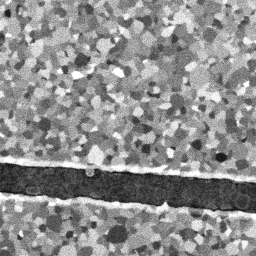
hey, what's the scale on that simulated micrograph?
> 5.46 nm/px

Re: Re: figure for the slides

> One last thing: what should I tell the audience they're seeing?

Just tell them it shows one or a few lines or trenches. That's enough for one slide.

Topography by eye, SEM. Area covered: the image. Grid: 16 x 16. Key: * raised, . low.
****************
****************
****************
****************
****************
****************
****************
****************
****************
****************
.......*********
................
***.............
****************
****************
****************